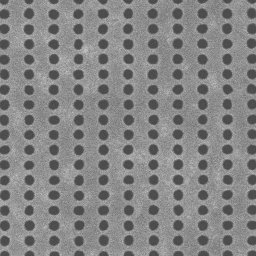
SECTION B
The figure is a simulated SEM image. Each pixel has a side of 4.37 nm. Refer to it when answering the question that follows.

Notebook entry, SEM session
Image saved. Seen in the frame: a regular array of holes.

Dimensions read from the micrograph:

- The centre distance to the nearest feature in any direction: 0.0653 micrometres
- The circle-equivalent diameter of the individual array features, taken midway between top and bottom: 0.0427 um